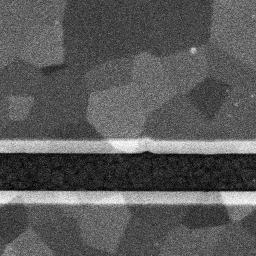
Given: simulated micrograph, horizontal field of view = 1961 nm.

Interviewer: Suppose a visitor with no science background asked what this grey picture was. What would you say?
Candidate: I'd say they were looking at one or a few lines or trenches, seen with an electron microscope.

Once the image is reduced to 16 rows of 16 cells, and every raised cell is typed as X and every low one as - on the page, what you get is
XXXXXXXXXXXXXXXX
XXXXXXXXXXXXXXXX
XXXXXXXXXXXXXXXX
XXXXXXXXXXXXXXXX
XXXXXXXXXXXXXXXX
XXXXXXXXXXXXXXXX
XXXXXXXXXXXXXXXX
XXXXXXXXXXXXXXXX
XXXXXXXXXXXXXXXX
----------------
----------------
----------------
XXXXXXXXXXXXXXXX
XXXXXXXXXXXXXXXX
XXXXXXXXXXXXXXXX
XXXXXXXXXXXXXXXX